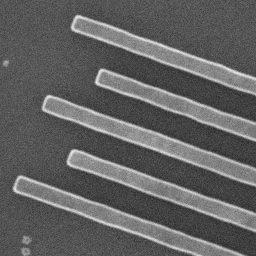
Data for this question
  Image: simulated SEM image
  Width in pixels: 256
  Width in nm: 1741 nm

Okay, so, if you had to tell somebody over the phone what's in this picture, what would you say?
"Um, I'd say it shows groups of lines, slits or small figures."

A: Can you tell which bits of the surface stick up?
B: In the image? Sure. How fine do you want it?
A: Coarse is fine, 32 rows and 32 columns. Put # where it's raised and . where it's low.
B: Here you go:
................................
................................
.........##.....................
.........#####..................
...........######...............
..............######............
.................######.........
...................######.......
......................######....
............###..........######.
............######..........####
...............######..........#
......##..........######........
.....#####..........######......
.......######..........######...
..........######..........######
.............######..........###
................######..........
...................######.......
.........###.........######.....
.........#####..........######..
...........######..........#####
..##..........######..........##
..#####..........######.........
....######..........#####.......
......#######..........#####....
.........######..........######.
............######..........####
...............######..........#
..................######........
....................#######.....
.......................######...